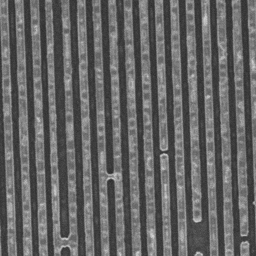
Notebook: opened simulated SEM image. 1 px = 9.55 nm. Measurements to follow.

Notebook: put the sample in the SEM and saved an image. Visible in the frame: parallel lines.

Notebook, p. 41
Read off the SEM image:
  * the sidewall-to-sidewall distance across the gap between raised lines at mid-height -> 70.4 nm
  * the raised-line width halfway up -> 77.6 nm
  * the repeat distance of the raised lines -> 148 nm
